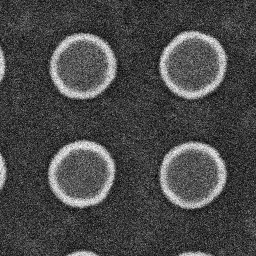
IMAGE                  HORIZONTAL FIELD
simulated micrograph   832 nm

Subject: raised bodies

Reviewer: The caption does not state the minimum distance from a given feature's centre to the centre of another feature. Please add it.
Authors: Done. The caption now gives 354 nanometers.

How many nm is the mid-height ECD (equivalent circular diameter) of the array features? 200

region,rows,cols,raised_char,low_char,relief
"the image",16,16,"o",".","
................
................
....oo.....oo...
...oooo...oooo..
...oooo...oooo..
....oo.....oo...
................
................
................
....oo.....oo...
...oooo...oooo..
...oooo...oooo..
....oo.....oo...
................
................
................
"